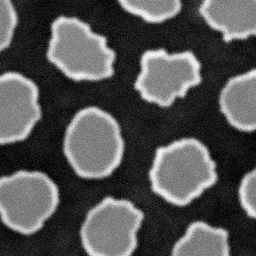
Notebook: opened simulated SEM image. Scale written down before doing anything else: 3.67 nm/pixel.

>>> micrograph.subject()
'raised bodies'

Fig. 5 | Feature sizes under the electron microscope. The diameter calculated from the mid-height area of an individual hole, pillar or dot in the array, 219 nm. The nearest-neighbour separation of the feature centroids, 338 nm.